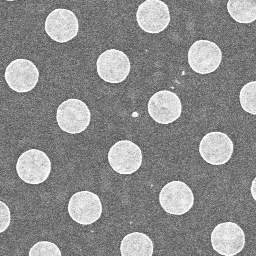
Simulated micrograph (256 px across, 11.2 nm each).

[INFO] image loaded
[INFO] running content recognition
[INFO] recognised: a regular array of raised bodies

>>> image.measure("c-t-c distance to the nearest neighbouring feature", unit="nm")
718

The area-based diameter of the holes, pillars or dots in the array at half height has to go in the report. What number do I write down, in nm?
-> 370